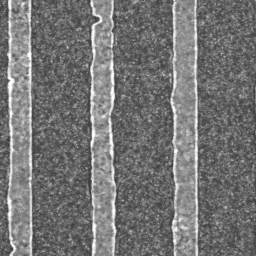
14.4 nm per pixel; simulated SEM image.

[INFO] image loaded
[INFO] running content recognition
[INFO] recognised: one or a few lines or trenches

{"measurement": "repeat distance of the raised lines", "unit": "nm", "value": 1190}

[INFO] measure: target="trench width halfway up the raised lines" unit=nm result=879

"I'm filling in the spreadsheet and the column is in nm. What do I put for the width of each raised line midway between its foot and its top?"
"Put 311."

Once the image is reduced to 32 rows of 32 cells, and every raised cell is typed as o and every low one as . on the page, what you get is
.ooo.......ooo........oo........
.ooo........oo........oo........
.ooo........oo........oo........
.ooo........oo........oo........
.ooo........oo........oo........
.ooo........oo........oo........
.ooo........oo........oo........
.ooo........oo........oo........
.ooo.......ooo........oo........
.ooo........oo........oo........
.ooo........oo........ooo.......
.ooo.......ooo........ooo.......
.ooo.......ooo.......oooo.......
.ooo.......ooo........ooo.......
.ooo.......ooo........ooo.......
.ooo........oo........ooo.......
.ooo........oo........ooo.......
.ooo........oo........ooo.......
.ooo.......ooo........ooo.......
.ooo........oo........ooo.......
.ooo........oo........ooo.......
.ooo........oo........ooo.......
.ooo.......ooo........ooo.......
.ooo.......ooo........ooo.......
.ooo.......ooo........ooo.......
.ooo........oo........ooo.......
.ooo........oo........ooo.......
.ooo........oo........ooo.......
.ooo........oo........ooo.......
.ooo........oo........ooo.......
.ooo........oo........ooo.......
..oo........oo........ooo.......